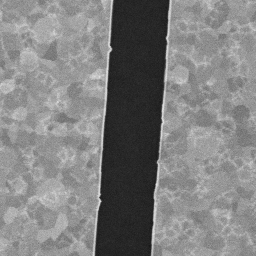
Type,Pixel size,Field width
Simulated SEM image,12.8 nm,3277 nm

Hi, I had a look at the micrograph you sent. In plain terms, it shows one or a few lines or trenches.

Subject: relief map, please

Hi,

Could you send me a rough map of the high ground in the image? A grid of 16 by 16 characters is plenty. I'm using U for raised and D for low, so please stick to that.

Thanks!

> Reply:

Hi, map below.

UUUUUUUDDDDUUUUU
UUUUUUUDDDDUUUUU
UUUUUUUDDDUUUUUU
UUUUUUUDDDUUUUUU
UUUUUUUDDDUUUUUU
UUUUUUUDDDUUUUUU
UUUUUUUDDDUUUUUU
UUUUUUDDDDUUUUUU
UUUUUUDDDDUUUUUU
UUUUUUDDDDUUUUUU
UUUUUUDDDDUUUUUU
UUUUUUDDDDUUUUUU
UUUUUUDDDDUUUUUU
UUUUUUDDDDUUUUUU
UUUUUUDDDDUUUUUU
UUUUUUDDDDUUUUUU